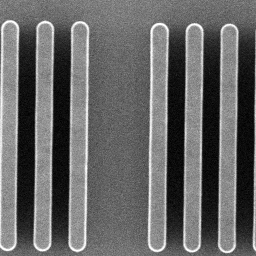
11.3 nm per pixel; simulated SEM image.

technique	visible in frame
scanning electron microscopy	groups of lines, slits or small figures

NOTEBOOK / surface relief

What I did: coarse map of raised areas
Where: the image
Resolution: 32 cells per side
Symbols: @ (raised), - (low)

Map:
--------------------------------
--------------------------------
--------------------------------
@@---@@--@@--------@@---@---@---
@@---@@--@@--------@@--@@---@@--
@@---@@--@@--------@@--@@---@@--
@@---@@--@@--------@@--@@---@@--
@@---@@--@@--------@@--@@---@@--
@@---@@--@@--------@@--@@---@@--
@@---@@--@@--------@@--@@---@@--
@@---@@--@@--------@@--@@---@@--
@@---@@--@@--------@@--@@---@@--
@@---@@--@@--------@@--@@---@@--
@@--@@@--@@--------@@--@@---@@--
@@--@@@--@@--------@@--@@---@@--
@@--@@@--@@--------@@--@@--@@@--
@@--@@@--@@--------@@--@@--@@@--
@@--@@---@@--------@@--@@--@@---
@@--@@---@@--------@@--@@--@@---
@@--@@---@@--------@@--@@--@@---
@@--@@---@@--------@@--@@--@@---
@@--@@---@@--------@@--@@--@@---
@@--@@---@@--------@@--@@--@@---
@@--@@---@@--------@@--@@--@@---
@@--@@---@@--------@@--@@--@@---
@@--@@---@@--------@@--@@--@@---
@@--@@---@@--------@@--@@--@@---
@@--@@---@@--------@@--@@--@@---
@@--@@---@@--------@@--@@--@@---
@@--@@---@@--------@@--@@--@@---
@@--@@---@@--------@@--@@--@@---
--------------------------------